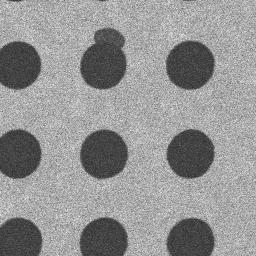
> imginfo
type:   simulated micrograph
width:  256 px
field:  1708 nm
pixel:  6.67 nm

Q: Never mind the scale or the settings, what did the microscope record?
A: holes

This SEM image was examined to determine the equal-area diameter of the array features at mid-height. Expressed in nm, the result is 325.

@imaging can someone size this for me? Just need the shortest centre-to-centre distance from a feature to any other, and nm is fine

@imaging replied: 575